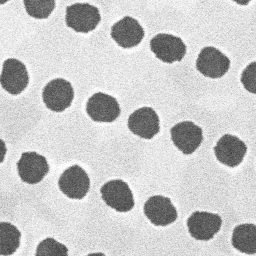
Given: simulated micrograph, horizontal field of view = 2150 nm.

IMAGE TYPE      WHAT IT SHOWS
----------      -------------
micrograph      a regular array of holes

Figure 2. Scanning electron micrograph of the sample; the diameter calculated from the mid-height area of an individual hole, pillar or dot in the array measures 282 nm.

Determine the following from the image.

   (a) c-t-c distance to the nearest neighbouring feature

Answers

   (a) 378 nm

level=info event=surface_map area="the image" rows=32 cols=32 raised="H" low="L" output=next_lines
HHHLLLLHHLLHHHHHHHHHHHHHHHHHHHLH
HHHLLLLHLLLLHHHHHHHHHHHHHHHHHHHH
HHHHHHHHLLLLLHHLLHHHHHHHHHHHHHHH
HHHHHHHHHLLLHHLLLLHHHHHHHHHHHHHH
HHHHHHHHHHHHHHLLLLHLLLHHHHHHHHHH
HHHHHHHHHHHHHHHLLHHLLLLHHHHHHHHH
HHHHHHHHHHHHHHHHHHHLLLLHHLLLHHHH
HLHHHHHHHHHHHHHHHHHHLLLHHLLLLHHH
LLLHHHHHHHHHHHHHHHHHHHHHHLLLLHHL
LLLLHHHHHHHHHHHHHHHHHHHHHHLLHHLL
LLLLHHLLLHHHHHHHHHHHHHHHHHHHHHLL
HLLHHLLLLHHHHHHHHHHHHHHHHHHHHHHL
HHHHHLLLLHHLLLLHHHHHHHHHHHHHHHHH
HHHHHHLLLHHLLLLHHLLHHHHHHHHHHHHH
HHHHHHHHHHHLLLLHLLLLHHHHHHHHHHHH
HHHHHHHHHHHHHHHHLLLLHHLLLHHHHHHH
HHHHHHHHHHHHHHHHLLLLHLLLLHHHHHHH
HHHHHHHHHHHHHHHHHHHHHLLLLHHLLLHH
LHHHHHHHHHHHHHHHHHHHHHLLLHHLLLLH
LHHLLHHHHHHHHHHHHHHHHHHHHHHLLLLH
HHLLLLHHHHHHHHHHHHHHHHHHHHHHLLHH
HHLLLLHHLLLHHHHHHHHHHHHHHHHHHHHH
HHHLLHHLLLLHHHLHHHHHHHHHHHHHHHHH
HHHHHHHLLLLHHLLLHHHHHHHHHHHHHHHH
HHHHHHHHLLLHHLLLLHHLHHHHHHHHHHHH
HHHHHHHHHHHHHLLLLHLLLLHHHHHHHHHH
HHHHHHHHHHHHHHHLHHLLLLHHLLHHHHHH
HHHHHHHHHHHHHHHHHHHLLLHLLLLLHHHH
LLHHHHHHHHHHHHHHHHHHHHHLLLLLHLLL
LLLHHHHHHHHHHHHHHHHHHHHHLLLHHLLL
LLLHHLLLHHHHHHHHHHHHHHHHHHHHHLLL
LLHHLLLLLHHHHHHHHHHHHHHHHHHHHHLL